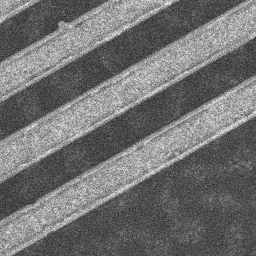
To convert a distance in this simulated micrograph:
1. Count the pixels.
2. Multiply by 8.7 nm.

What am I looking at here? one or a few lines or trenches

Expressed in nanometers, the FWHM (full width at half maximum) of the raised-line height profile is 278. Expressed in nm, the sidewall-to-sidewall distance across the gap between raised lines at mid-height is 321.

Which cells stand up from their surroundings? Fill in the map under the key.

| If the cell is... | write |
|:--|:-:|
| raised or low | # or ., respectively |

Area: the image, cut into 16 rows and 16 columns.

#.....####.....#
....####.....###
...####....####.
.####.....####..
###.....####....
#.....####.....#
....####.....###
...####....####.
.####.....####..
###.....####....
#.....####......
....####........
...####.........
.####...........
###.............
#...............